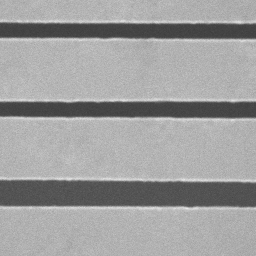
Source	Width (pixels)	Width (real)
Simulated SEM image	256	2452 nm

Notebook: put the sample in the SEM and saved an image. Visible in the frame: lines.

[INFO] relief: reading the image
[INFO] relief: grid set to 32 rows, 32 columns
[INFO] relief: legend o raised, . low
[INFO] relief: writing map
oooooooooooooooooooooooooooooooo
oooooooooooooooooooooooooooooooo
oooooooooooooooooooooooooooooooo
................................
................................
oooooooooooooooooooooooooooooooo
oooooooooooooooooooooooooooooooo
oooooooooooooooooooooooooooooooo
oooooooooooooooooooooooooooooooo
oooooooooooooooooooooooooooooooo
oooooooooooooooooooooooooooooooo
oooooooooooooooooooooooooooooooo
oooooooooooooooooooooooooooooooo
................................
................................
oooooooooooooooooooooooooooooooo
oooooooooooooooooooooooooooooooo
oooooooooooooooooooooooooooooooo
oooooooooooooooooooooooooooooooo
oooooooooooooooooooooooooooooooo
oooooooooooooooooooooooooooooooo
oooooooooooooooooooooooooooooooo
........o..ooooooooooooooooooooo
................................
................................
................................
oooooooooooooooooooooooooooooooo
oooooooooooooooooooooooooooooooo
oooooooooooooooooooooooooooooooo
oooooooooooooooooooooooooooooooo
oooooooooooooooooooooooooooooooo
oooooooooooooooooooooooooooooooo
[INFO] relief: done